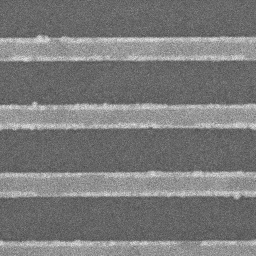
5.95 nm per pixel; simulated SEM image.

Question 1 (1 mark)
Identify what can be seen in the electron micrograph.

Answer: one or a few lines or trenches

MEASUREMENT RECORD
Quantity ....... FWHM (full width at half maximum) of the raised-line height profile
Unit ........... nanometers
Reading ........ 136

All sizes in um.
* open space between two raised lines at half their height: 0.267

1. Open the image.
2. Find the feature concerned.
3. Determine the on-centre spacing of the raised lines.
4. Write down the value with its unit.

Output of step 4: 403 nanometres